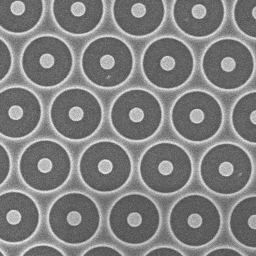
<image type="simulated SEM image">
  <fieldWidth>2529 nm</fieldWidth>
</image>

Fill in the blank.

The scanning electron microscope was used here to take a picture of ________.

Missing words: an array of small figures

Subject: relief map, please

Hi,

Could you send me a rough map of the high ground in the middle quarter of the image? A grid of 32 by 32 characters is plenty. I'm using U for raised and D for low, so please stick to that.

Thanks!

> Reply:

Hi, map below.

DDUUDDDDDUUUDDDDDUUUDDDDUUUUDDDD
DDUUUDDDDDDDDDDDDUUUDDDDDDDDDDDD
DUUUUDDDDDDDDDDDDUUUDDDDDDDDDDDD
DUUUUUDDDDDDDDDDUUUUUDDDDDDDDDDU
UUUUUUUDDDDDDDDUUUUUUDDDDDDDDDUU
UUUUUUUUUDDDDDUUUUUUUUUDDDDDDUUU
DDDDDDUUUUUUUUUUDDDDUUUUUUUUUUUU
DDDDDDDUUUUUUUDDDDDDDDUUUUUUUUDD
DDDDDDDDUUUUUDDDDDDDDDDUUUUUUDDD
DDDDDDDDDUUUUDDDDDDDDDDDUUUUDDDD
DDDDDDDDDUUUDDDDDDDDDDDDUUUDDDDD
DDUUDDDDDDUUDDDDDUUDDDDDDUUDDDDD
DUUUUDDDDDUDDDDDUUUUDDDDDUUDDDDD
DDUUDDDDDUUUDDDDDUUUDDDDDUUDDDDD
DDDDDDDDDUUUDDDDDDDDDDDDUUUDDDDD
DDDDDDDDDUUUDDDDDDDDDDDDUUUDDDDD
DDDDDDDDUUUUUDDDDDDDDDDUUUUUDDDD
DDDDDDDUUUUUUUDDDDDDDDUUUUUUUDDD
UDDDDDUUUUUUUUUDDDDDDUUUUUUUUUDD
UUUUUUUUDDDDDUUUUUUUUUUUUUUUUUUU
UUUUUUDDDDDDDDUUUUUUUUDDDDDDDUUU
DUUUUDDDDDDDDDDUUUUUUDDDDDDDDDUU
DUUUDDDDDDDDDDDDUUUUDDDDDDDDDDDU
DDUUDDDDDDDDDDDDUUUDDDDDDDDDDDDD
DDUUDDDDDUUDDDDDDUUDDDDDDUDDDDDD
DDUUDDDDDUUUDDDDDUUDDDDDUUUDDDDD
DDUUDDDDDUUUDDDDDUUDDDDDUUUDDDDD
DUUUDDDDDDDDDDDDDUUDDDDDDUDDDDDD
DUUUDDDDDDDDDDDDUUUDDDDDDDDDDDDD
UUUUUDDDDDDDDDDDUUUUDDDDDDDDDDDU
UUUUUUDDDDDDDDDUUUUUUDDDDDDDDDUU
UUUUUUUUDDDDDUUUUUUUUUDDDDDDDUUU